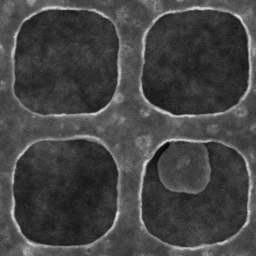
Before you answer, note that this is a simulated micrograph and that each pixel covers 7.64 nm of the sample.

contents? holes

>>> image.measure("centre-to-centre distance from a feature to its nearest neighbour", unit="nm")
989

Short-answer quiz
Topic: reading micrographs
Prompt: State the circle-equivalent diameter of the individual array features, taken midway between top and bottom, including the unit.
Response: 853 nanometers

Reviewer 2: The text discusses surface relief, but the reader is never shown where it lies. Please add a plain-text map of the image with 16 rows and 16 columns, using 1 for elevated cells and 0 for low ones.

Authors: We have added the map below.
1111111111111111
1000000111000001
1000000110000000
1000000110000000
1000000110000000
1000000110000001
1000000111000001
1111111111111111
1111111111111111
1100000111000001
1000000110000001
1000000110000000
1000000110000001
1000000110000001
1000000110000001
1111111111111111